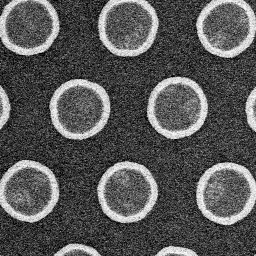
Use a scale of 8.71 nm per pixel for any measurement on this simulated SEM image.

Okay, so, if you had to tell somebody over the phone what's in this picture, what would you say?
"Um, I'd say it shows raised bodies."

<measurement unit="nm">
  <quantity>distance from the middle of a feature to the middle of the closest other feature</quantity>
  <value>843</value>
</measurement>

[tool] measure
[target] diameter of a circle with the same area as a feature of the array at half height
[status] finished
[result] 54.9 px